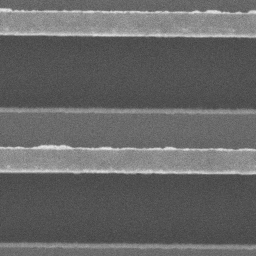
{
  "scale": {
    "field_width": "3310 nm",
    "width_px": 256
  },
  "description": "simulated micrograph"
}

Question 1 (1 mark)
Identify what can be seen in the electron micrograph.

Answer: lines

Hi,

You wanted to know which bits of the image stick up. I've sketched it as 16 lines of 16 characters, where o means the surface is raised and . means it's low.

oooooooooooooooo
oooooooooooooooo
................
................
................
................
................
oooooooooooooooo
oooooooooooooooo
oooooooooooooooo
oooooooooooooooo
................
................
................
................
ooooooooooooooo.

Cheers